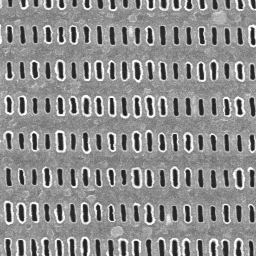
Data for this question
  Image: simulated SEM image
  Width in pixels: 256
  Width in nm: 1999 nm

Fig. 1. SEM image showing a regular array of holes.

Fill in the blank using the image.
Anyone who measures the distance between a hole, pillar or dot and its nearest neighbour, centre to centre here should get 0.0994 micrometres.